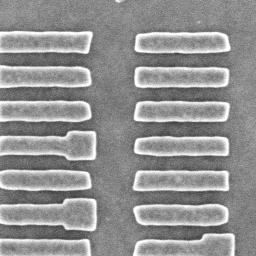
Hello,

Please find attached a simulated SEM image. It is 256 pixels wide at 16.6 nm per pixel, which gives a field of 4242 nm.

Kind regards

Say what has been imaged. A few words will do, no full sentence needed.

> wiring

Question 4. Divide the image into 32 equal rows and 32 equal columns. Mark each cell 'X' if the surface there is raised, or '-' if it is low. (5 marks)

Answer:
--------------------------------
--------------------------------
--------------------------------
--------------------------------
XXXXXXXXXXX------XXXXXXXXXXX----
XXXXXXXXXXX------XXXXXXXXXXXX---
---------XX-------XXXXXXXX------
--------------------------------
XXXXXXXXXX-------XXXXXXX--X-----
XXXXXXXXXXX------XXXXXXXXXXX----
XXXXXXXXXXX------XXXXXXXXXXX----
--------------------------------
--------------------------------
XXXXXXXXXXX------XXXXXXXXXXXX---
XXXXXXXXXXX------XXXXXXXXXXX----
--------------------------------
---------X----------------------
XXXXXXXXXXXX-----XXXXXXXXXXX----
XXXXXXXXXXXX-----XXXXXXXXXXX----
--------XXXX--------------------
--------------------------------
XXXXXXXXXX-------XXXXXXXXXXX----
XXXXXXXXXXX------XXXXXXXXXXX----
XXXXXXXXXXX------XXXXXXXXXXX----
--------------------------------
-------XXXXX--------------------
XXXXXXXXXXXX-----XXXXXXXXXXX----
XXXXXXXXXXXX-----XXXXXXXXXXX----
--------XXXX--------------------
--------------------------XXX---
XXXXXXXXXXX------XXXXXXXXXXXX---
XXXXXXXXXXX------XXXXXXXXXXXX---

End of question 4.